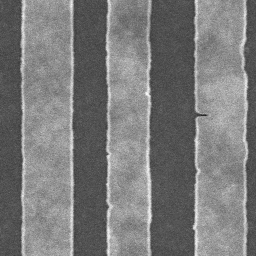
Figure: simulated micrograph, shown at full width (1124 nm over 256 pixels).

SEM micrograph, one or a few lines or trenches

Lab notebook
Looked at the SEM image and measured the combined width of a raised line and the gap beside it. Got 380 nanometres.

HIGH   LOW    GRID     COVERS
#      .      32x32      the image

...######.....#####......######.
...######.....#####......######.
...######.....#####......######.
...######.....#####......######.
...######....######......######.
...######....######......#####..
...######.....#####......#####..
...######....######......#####..
...######....######......#####..
...######....######......######.
...######.....#####......######.
...######.....#####......######.
...######.....#####......######.
...######.....#####......######.
...######....######......######.
...######.....#####......######.
...######.....#####......######.
...######.....#####......######.
...######....######......######.
...######.....####.......######.
...######.....####.......######.
...######.....#####......######.
...######....######......######.
...######....######......######.
...######....######......######.
...######.....#####......######.
...######.....#####......######.
...######....######......######.
...######....######.....#######.
...######.....#####......######.
...######.....#####......######.
...######.....#####......######.